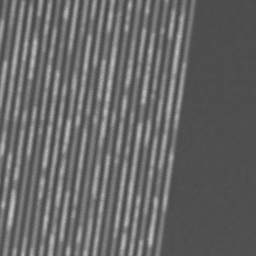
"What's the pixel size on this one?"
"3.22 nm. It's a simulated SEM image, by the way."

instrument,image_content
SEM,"parallel lines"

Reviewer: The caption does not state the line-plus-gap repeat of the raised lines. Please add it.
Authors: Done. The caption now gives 28.6 nm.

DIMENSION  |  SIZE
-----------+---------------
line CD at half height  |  11.1 nm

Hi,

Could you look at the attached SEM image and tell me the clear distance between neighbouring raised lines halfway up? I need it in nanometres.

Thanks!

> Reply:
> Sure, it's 16.3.